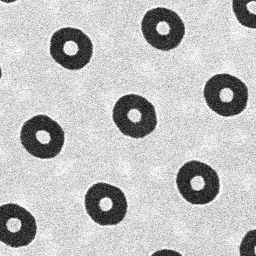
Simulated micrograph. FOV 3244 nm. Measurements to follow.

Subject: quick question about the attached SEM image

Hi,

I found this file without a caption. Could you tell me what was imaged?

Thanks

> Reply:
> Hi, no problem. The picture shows ring-shaped grooves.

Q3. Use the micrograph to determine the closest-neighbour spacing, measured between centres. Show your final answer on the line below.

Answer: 1.16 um